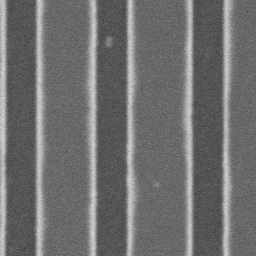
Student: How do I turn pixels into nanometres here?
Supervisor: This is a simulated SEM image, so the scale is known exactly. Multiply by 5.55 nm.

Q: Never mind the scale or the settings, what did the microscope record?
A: lines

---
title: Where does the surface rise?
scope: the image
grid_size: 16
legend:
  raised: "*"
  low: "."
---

..****..****..**
..****..****..**
..****..****..**
..****..****..**
..****..****..**
..****..****..**
..****..****..**
..****..****..**
..****..****..**
..****..****..**
..****..****..**
..****..****..**
..****..****..**
..****..****..**
..****..****..**
..****..****..**